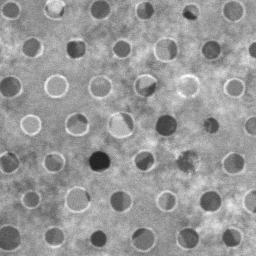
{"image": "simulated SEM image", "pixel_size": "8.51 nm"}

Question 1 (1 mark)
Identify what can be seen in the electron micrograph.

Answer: a regular array of raised bodies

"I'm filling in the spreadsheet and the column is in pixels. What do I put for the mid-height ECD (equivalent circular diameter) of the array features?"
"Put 21.9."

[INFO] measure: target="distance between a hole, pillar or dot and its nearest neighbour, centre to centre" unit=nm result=367